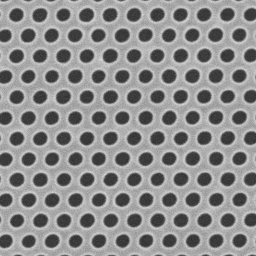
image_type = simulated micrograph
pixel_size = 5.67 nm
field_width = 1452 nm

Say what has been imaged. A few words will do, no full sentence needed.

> a regular array of holes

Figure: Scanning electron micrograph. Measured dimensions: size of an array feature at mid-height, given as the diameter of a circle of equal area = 82.5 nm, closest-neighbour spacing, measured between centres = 23.3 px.